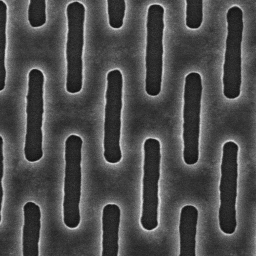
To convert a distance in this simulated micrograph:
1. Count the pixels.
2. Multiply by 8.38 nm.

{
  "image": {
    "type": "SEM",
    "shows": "a regular array of holes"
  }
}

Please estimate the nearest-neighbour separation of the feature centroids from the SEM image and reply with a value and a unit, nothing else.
642 nm